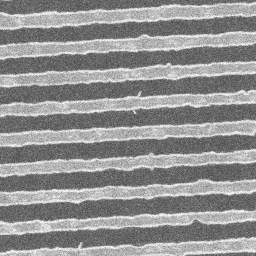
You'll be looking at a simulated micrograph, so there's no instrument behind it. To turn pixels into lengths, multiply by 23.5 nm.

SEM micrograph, parallel lines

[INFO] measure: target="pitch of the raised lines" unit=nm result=692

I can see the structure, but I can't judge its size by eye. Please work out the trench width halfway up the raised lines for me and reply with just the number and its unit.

0.428 µm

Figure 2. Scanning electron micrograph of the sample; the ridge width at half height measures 10.6 pixels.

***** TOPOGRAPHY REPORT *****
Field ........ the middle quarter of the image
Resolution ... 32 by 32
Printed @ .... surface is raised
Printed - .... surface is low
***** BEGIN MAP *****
-----------------------@@@@-@---
-------------@@--@@@@@@@@@@@@@@@
@@@@@@@@@@@@@@@@@@@@@@@@@@@@@@@@
@@@@@@@@@@@@@@@@@@@@@@@@-@@@@---
@@@@@@@-------------------------
--------------------------------
--------------------------------
--------------------------------
----------------@@@@@@@@@@@@@@@@
---@@@@@@@@@@@@@@@@@@@@@@@@@@@@@
@@@@@@@@@@@@@@@@@@@@@@@@@-@@@---
@@@@@@@@@@@------@--------------
--------------------------------
--------------------------------
--------------------------------
--------------------------@---@@
-------@@@@@@@@@@@@@@@@@@@@@@@@@
@@@@@@@@@@@@@@@@@@@@@@@@@@@@@@@@
@@@@@@@@@@@@@@@@@@@----@--------
--------------------------------
--------------------------------
--------------------------------
--------------------------------
---------------@@-@@@@@@@@@@@@@@
@@@@@@@@@@@@@@@@@@@@@@@@@@@@@@@@
@@@@@@@@@@@@@@@@@@@-@@@@@@@-----
@@@@-@@@------------------------
--------------------------------
--------------------------------
--------------------------------
----------------------@@@--@@@@@
-------@@@@@@@@@@@@@@@@@@@@@@@@@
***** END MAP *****